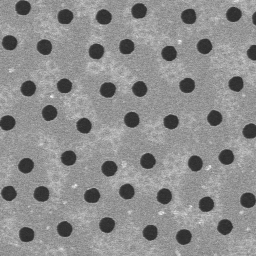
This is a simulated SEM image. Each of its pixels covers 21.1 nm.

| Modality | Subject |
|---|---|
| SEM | a regular array of holes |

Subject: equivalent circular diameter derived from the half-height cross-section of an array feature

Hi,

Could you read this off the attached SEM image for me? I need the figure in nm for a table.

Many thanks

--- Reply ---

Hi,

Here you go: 332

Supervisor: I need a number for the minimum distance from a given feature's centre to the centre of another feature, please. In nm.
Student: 711